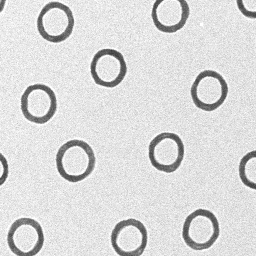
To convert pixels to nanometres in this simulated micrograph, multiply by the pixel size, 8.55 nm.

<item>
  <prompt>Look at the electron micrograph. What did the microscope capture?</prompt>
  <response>ring-shaped grooves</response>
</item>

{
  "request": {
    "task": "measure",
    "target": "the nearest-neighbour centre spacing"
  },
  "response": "636 nm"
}